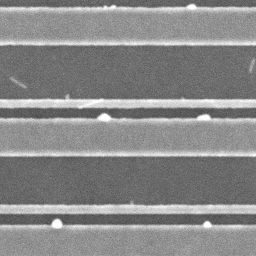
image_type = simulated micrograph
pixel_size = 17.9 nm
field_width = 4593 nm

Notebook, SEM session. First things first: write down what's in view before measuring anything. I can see lines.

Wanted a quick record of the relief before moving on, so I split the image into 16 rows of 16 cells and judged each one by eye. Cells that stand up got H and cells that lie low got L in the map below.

HHHHHHHHHHHHHHHH
HHHHHHHHHHHHHHHH
HHHHHHHHHHHHHHHH
LLLLLLLLLLLLLLLL
LLLLLLLLLLLLLLLL
LLLLLLLLLLLLLLLL
HHHHHHHHHHHHHHHH
HHHHHHHHHHHHHHHH
HHHHHHHHHHHHHHHH
HHHHHHHHHHHHHHHH
LLLLLLLLLLLLLLLL
LLLLLLLLLLLLLLLL
LLLLLLLLLLLLLLLL
HHHHHHHHHHHHHHHH
HHHHHHHHHHHHHHHH
HHHHHHHHHHHHHHHH